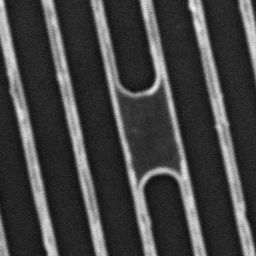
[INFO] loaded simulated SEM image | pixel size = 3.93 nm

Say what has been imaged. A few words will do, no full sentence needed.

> parallel lines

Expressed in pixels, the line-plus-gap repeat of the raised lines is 48.2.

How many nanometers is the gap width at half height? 154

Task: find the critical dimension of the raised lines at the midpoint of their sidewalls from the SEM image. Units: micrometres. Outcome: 0.0351